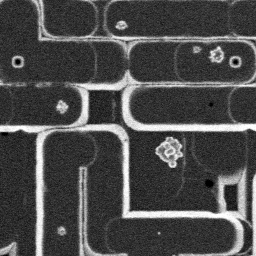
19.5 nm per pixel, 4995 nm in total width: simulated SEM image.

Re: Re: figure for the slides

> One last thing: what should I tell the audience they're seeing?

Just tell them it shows wiring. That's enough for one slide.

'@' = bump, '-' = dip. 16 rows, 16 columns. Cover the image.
@@@@@@@@@@@@@@@@
@@@@@@@@@@@@@@@@
@@@@@@@@@@@@@@@@
@@@@@@@@@@@@@@@@
@@@@@@@@@@@@@@@@
@@@@@@--@@@@@@@@
@@@@@---@@@@@@@@
@@@@@---@@@@@@@@
---@@@@@--------
---@@@@@--------
---@@@@@--------
---@@@@@--------
---@@@@@--------
---@@@@@@@@@@@--
--@@@@@@@@@@@@@-
--@@@@@@@@@@@@@-